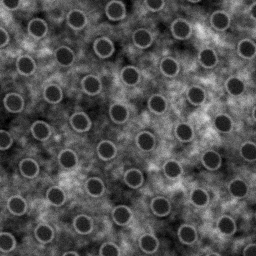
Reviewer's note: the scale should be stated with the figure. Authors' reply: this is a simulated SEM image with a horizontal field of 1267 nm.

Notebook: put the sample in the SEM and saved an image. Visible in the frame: a regular array of raised bodies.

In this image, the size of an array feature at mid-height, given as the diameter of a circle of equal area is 96.4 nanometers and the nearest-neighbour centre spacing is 192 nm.